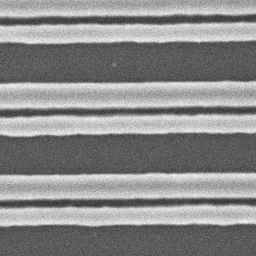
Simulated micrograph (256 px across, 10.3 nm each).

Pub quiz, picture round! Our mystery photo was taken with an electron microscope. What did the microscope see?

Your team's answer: lines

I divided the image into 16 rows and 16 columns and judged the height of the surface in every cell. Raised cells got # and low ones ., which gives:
################
################
################
................
................
################
################
################
................
................
................
################
################
################
................
................